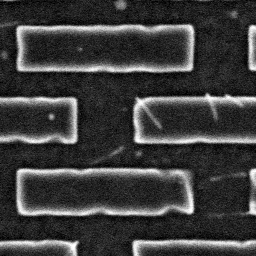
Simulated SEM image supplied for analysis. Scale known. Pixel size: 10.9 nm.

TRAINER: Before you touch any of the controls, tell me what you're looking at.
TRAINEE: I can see groups of lines, slits or small figures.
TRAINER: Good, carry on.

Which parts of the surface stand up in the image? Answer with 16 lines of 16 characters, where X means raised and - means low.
----------------
----------------
-XXXXXXXXXXX----
-XXXXXXXXXXX----
----------------
----------------
XXXXX----XXXXXXX
XXXXX---XXXXXXXX
XXXXX----XXXXXXX
----------------
----------------
-XXXXXXXXXXX----
-XXXXXXXXXXX----
----------------
----------------
XXXXX---XXXXXXXX